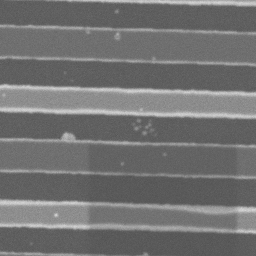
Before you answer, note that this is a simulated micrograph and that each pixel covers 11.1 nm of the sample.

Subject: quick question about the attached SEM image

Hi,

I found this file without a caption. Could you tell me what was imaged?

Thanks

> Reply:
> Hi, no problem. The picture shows lines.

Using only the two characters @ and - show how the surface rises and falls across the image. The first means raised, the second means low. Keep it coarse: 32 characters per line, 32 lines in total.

-----------------------------@@@
--------------------------------
--------------------------------
@@@@@@@@@@----------------------
@@@@@@@@@@@@@@@@@@@@@@@@@@@@@@@@
@@@@@@@@@@@@@@@@@@@@@@@@@@@@@@@@
@@@@@@@@@@@@@@@@@@@@@@@@@@@@@@@@
---------@@@@@@@@@@@@@@@@@@@@@@@
--------------------------------
--------------------------------
--------------------------------
@@@@@@@@@@@@@@@@@@@@@@@@@@@-----
@@@@@@@@@@@@@@@@@@@@@@@@@@@@@@@@
@@@@@@@@@@@@@@@@@@@@@@@@@@@@@@@@
-------------------------@@@@@@@
--------------------------------
--------------------------------
@@@@----@-----------------------
@@@@@@@@@@@@@@@@@@@@@@@@@@@@@@@@
@@@@@@@@@@@@@@@@@@@@@@@@@@@@@@@@
@@@@@@@@@@@@@@@@@@@@@@@@@@@@@@@@
-----@@@@@@@@@@@@@@@@@@@@@@@@@@@
--------------------------------
--------------------------------
--------------------------------
@@@@@@@@@@@@@@@-----------------
@@@@@@@@@@@@@@@@@@@@@@@@@@@@@@@@
@@@@@@@@@@@@@@@@@@@@@@@@@@@@@@@@
------------------@@@@@@@@@@@@@@
--------------------------------
--------------------------------
--------------------------------